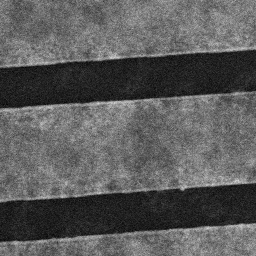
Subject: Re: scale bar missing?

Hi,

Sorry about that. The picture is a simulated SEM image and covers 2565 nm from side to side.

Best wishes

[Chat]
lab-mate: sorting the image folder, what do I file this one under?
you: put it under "one or a few lines or trenches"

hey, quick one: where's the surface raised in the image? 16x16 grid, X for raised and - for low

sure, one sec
XXXXXXXXXXXXXXXX
XXXXXXXXXXXXXXXX
XXXXXXXXXXXXXXXX
XXXXXXXX--------
----------------
----------------
-----XXXXXXXXXXX
XXXXXXXXXXXXXXXX
XXXXXXXXXXXXXXXX
XXXXXXXXXXXXXXXX
XXXXXXXXXXXXXXXX
XXXXXXXXXXXXXX--
----------------
----------------
----------XXXXXX
XXXXXXXXXXXXXXXX